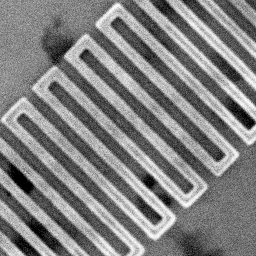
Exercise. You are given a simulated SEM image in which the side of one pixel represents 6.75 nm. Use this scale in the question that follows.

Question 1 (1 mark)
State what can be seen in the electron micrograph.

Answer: groups of lines, slits or small figures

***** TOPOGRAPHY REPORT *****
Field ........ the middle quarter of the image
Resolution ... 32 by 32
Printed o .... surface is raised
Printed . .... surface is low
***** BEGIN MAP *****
...ooo.....ooo....oooo.....oo...
....ooo.....ooo....oooo....ooo..
.....ooo.....ooo....oooo....ooo.
o.....ooo....oooo....oooo....ooo
oo....oooo....oooo....oooo....oo
ooo....oooo....oooo....oooo....o
oooo....oooo....oooo....ooo.....
..ooo.....ooo.....ooo.....ooo...
...ooo.....ooo.....ooo.....ooo..
....ooo.....ooo.....ooo....oooo.
.....ooo.....ooo....oooo....oooo
o.....ooo....oooo....oooo....ooo
oo....oooo....oooo....oooo....oo
ooo....oooo.....ooo....oooo....o
.ooo.....ooo.....ooo.....ooo....
..ooo.....ooo.....ooo.....ooo...
...ooo.....ooo.....ooo.....ooo..
....ooo.....ooo.....ooo....oooo.
.....ooo.....ooo.....ooo....oooo
o.....ooo.....ooo.....ooo....ooo
oo.....ooo.....ooo.....ooo....oo
ooo.....ooo.....ooo.....ooo.....
.ooo.....ooo.....ooo.....ooo....
..ooo.....ooo.....ooo.....ooo...
...ooo.....ooo.....ooo.....ooo..
....ooo.....ooo.....ooo.....ooo.
.....ooo.....ooo.....ooo.....ooo
o.....ooo.....ooo.....ooo.....oo
oo.....ooo.....ooo.....ooo.....o
ooo.....ooo.....ooo.....ooo.....
.ooo.....ooo.....ooo.....ooo....
..ooo.....ooo.....ooo.....ooo...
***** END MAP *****